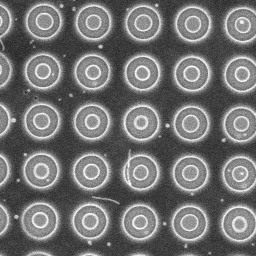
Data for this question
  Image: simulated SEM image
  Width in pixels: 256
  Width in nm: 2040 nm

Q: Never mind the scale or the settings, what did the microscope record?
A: an array of small figures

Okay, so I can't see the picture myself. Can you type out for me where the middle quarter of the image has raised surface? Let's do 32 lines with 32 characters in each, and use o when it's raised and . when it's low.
ooo....o...ooooo.......ooooo....
ooo...ooo..ooooo..ooo...oooo..oo
ooo...ooo..oooo...ooo...oooo..oo
ooo...oo...ooooo..ooo..ooooo..oo
oooo......oooooo.......ooooo....
ooooo....oooooooo.....ooooooo...
ooooooooooooooooooooooooooooooo.
oooooooooooooooooooooooooooooooo
oooooooooooooooooooooooooooooooo
oooooooooooooooooooooooooooooooo
oooooo..oooooooooooooooooooooooo
oooo......ooooooo.....oooooooo..
ooo........ooooo.......oooooo...
ooo...oo...oooo...oo...ooooo..oo
ooo...ooo..oooo...ooo...oooo..oo
ooo...oo...oooo...oo...ooooo..oo
ooo.......oooooo.......ooooo..oo
oooo......oooooo......ooooooo...
oooooo.ooooooooooo...ooooooooo..
oooooooooooooooooooooooooooooooo
oooooooooooooooooooooooooooooooo
oooooooooooooooooooooooooooooooo
oooooooooooooooooooooooooooooooo
ooooo....oooooooo....ooooooooo..
ooo.......oooooo......ooooooo...
ooo...oo...oooo....o...ooooo...o
ooo..oooo..oooo...ooo..ooooo..oo
ooo..oooo..oooo..oooo..ooooo..oo
ooo...oo..ooooo...oo...ooooo..oo
oooo......oooooo.......ooooo....
ooooo....oooooooo.....ooooooo...
ooooooooooooooooooooooooooooooo.